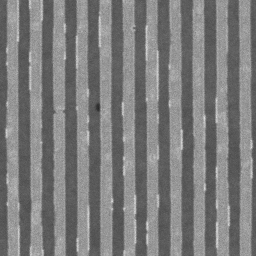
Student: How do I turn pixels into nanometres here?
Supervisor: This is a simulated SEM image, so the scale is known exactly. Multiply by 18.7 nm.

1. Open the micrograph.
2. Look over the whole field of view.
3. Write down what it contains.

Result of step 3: parallel lines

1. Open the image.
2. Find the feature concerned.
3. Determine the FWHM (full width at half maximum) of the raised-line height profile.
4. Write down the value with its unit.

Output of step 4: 196 nanometers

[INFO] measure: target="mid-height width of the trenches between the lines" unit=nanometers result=250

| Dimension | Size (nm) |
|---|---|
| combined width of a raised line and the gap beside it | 436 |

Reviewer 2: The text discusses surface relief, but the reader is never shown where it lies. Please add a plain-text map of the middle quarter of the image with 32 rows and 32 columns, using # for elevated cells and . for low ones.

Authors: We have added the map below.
...###...###...##....##....##...
...###...###...##....##....##...
...###...###...##....##....##...
...###...###...##....##...###...
...###...###...##....##...###...
...###...###...##....##....##...
...###...###...##....##....##...
...###...###...##....##....##...
...###...###...##....##....##...
...###...###...##....##....##...
...###...###...##....##....##...
...###...###...##....##....##...
...###...###...##....##....##...
...###...###...##....##....##...
....##...###...##....##....##...
....##...###...##....##....##...
....##...###...##....##....##...
....##...###...##....##....##...
....##...###...##....###...##...
....##...###...##....###...##...
....##...###...##....##....##...
....##...###...##....##....##...
....##...###...##....##....##...
....##...###...###...#.....##...
....##...###...#.#...##....##...
....##...###...#.....##....##...
....##...###...##....##....##...
....##...###...##....##....##...
....##...###...##....##....##...
....##...###...###...##....##...
....##...###...###...##....##...
....##...###...###...##....##...